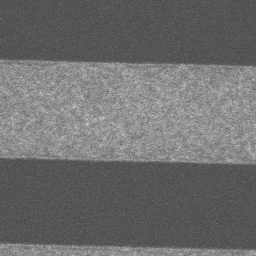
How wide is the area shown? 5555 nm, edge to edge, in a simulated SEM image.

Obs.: one or a few lines or trenches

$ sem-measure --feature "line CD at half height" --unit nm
1920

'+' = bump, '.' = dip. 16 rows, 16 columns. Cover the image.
++++++++++++++++
++++++++++++++++
++++++++++++++++
++++++++++++++++
................
................
................
................
................
................
++++++++++++++++
++++++++++++++++
++++++++++++++++
++++++++++++++++
++++++++++++++++
........++++++++